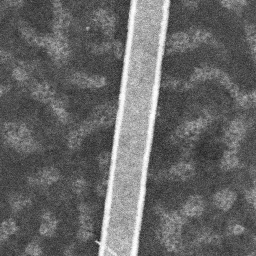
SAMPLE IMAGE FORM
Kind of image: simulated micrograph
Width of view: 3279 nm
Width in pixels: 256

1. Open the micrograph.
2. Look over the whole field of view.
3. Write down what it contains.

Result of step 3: one or a few lines or trenches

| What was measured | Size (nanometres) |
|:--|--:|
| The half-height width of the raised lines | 398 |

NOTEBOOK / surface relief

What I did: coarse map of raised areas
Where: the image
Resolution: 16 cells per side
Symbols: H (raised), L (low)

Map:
LLLLLLLLHHLLLLLL
LLLLLLLLHHLLLLLL
LLLLLLLLHHLLLLLL
LLLLLLLLHHLLLLLL
LLLLLLLLHHLLLLLL
LLLLLLLLHHLLLLLL
LLLLLLLLHHLLLLLL
LLLLLLLHHLLLLLLL
LLLLLLLHHLLLLLLL
LLLLLLLHHLLLLLLL
LLLLLLLHHLLLLLLL
LLLLLLLHHLLLLLLL
LLLLLLLHHLLLLLLL
LLLLLLLHHLLLLLLL
LLLLLLLHHLLLLLLL
LLLLLLHHLLLLLLLL